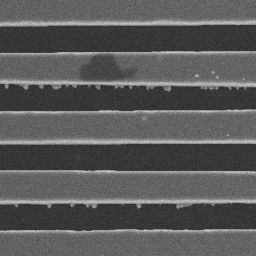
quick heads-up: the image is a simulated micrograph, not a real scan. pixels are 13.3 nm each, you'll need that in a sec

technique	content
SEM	lines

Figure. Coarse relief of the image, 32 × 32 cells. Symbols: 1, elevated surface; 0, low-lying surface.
11111111111111111111111111111111
11111111111111111111111111111111
11111111111111111111111111111111
00000000000000000000000000000000
00000000000000000000000000000000
00000000000000000000000000000000
00000000000000000001111111111111
11111111111111111111111111111111
11111111111111111111111111111111
11111111111111111111111111111111
00111111111111111111111111111111
00000000000000000000000000000000
00000000000000000000000000000000
00000000000000000000000000000000
11111111111111111111111111111111
11111111111111111111111111111111
11111111111111111111111111111111
11111111111111111111111111111111
00000000000000000000000000000000
00000000000000000000000000000000
00000000000000000000000000000000
11111111111111111111111111111111
11111111111111111111111111111111
11111111111111111111111111111111
11111111111111111111111111111111
10000000000000000000000000000000
00000000000000000000000000000000
00000000000000000000000000000000
00000000000000000000000000000000
11111111111111111111111111111111
11111111111111111111111111111111
11111111111111111111111111111111